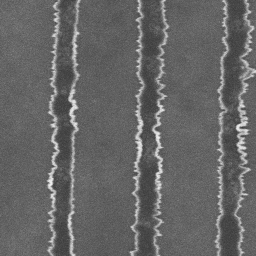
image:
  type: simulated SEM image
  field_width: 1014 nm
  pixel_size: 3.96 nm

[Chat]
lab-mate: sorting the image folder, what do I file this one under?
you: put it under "one or a few lines or trenches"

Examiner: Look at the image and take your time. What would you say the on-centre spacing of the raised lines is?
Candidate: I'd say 84.6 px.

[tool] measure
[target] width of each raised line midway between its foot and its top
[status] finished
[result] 23.4 px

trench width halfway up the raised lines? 242 nanometers